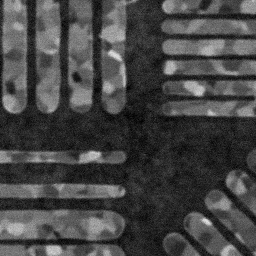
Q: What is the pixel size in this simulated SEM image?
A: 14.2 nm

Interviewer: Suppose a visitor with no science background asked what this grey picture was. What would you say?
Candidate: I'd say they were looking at groups of lines, slits or small figures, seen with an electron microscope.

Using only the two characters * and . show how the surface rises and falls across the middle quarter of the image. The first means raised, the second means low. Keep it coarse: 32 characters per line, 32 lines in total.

.******...*****..........*******
.******...*****..........*******
.******...*****................*
.******...*****.................
.******...*****...........**.***
.******...*****..........*******
..*****...*****..........*******
..*****...*****...............**
..*****...*****.................
..*****...*****.................
..*****...*****..........*******
...***.....***...........*******
.........................*******
................................
................................
................................
................................
................................
................................
................................
................................
................................
***************.................
***************.................
*****......***..................
................................
................................
................................
................................
................................
*********.......................
***************.................